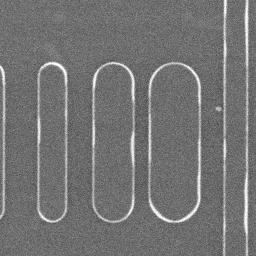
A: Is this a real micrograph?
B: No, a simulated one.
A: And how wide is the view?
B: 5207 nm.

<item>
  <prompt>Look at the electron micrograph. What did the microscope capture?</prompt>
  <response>groups of lines, slits or small figures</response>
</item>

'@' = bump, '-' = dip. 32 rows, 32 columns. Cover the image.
----------------------------@@@-
----------------------------@@@-
----------------------------@@@-
----------------------------@@@-
----------------------------@@@-
----------------------------@@@-
----------------------------@@@-
----------------------------@@@-
-----@@@-----@@@----@@@@----@@@-
-----@@@----@@@@---@@@@@----@@@-
-----@@@----@@@@@--@@@@@@---@@@-
-----@@@----@@@@@--@@@@@@---@@@-
-----@@@----@@@@@--@@@@@@---@@@-
-----@@@----@@@@@--@@@@@@---@@@-
-----@@@----@@@@@--@@@@@@---@@@-
-----@@@----@@@@@--@@@@@@---@@@-
-----@@@----@@@@@--@@@@@@---@@@-
-----@@@----@@@@@--@@@@@@---@@@-
-----@@@----@@@@@--@@@@@@---@@@-
-----@@@----@@@@@--@@@@@@---@@@-
-----@@@----@@@@@--@@@@@@---@@@-
-----@@@----@@@@@--@@@@@@---@@@-
-----@@@----@@@@@--@@@@@@---@@@-
-----@@@----@@@@@--@@@@@@---@@@-
-----@@@----@@@@@--@@@@@@---@@@-
-----@@@----@@@@@--@@@@@@---@@@-
-----@@@----@@@@----@@@@----@@@-
------@------@@------@@-----@@@-
----------------------------@@@-
----------------------------@@@-
----------------------------@@@-
----------------------------@@@-